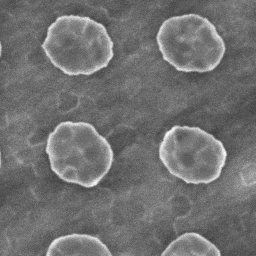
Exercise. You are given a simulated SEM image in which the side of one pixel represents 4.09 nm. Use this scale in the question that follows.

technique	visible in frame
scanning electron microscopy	raised bodies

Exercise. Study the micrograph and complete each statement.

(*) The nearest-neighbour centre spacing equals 449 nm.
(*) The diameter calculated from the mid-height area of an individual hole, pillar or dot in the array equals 0.254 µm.